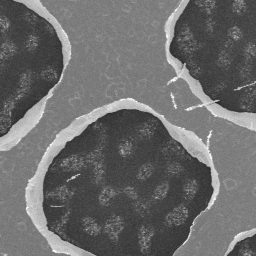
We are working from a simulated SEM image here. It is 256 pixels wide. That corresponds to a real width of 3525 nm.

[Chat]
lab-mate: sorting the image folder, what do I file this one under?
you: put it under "holes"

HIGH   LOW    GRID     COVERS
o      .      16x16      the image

..ooooooooo.....
....ooooooo.....
....ooooooo.....
....ooooooo.....
....ooooooo.....
...ooooooooo....
...oooooooooo...
..oooo....ooooo.
.oooo.......oooo
ooo..........ooo
ooo..........ooo
oo...........ooo
oo...........ooo
oo..........oooo
ooo.........oooo
oooo.......ooo..